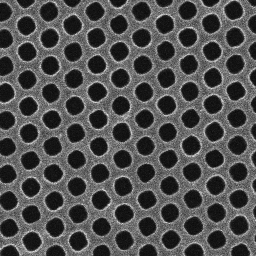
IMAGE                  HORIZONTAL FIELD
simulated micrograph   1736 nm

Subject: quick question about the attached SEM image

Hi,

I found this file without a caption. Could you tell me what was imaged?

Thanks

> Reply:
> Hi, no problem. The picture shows a regular array of holes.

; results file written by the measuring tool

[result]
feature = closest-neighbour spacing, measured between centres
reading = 179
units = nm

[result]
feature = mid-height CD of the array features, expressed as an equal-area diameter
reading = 116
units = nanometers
